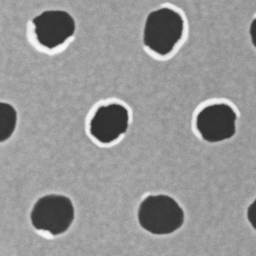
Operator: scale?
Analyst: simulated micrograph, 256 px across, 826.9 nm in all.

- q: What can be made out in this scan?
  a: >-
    holes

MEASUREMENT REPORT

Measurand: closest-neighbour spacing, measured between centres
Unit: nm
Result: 345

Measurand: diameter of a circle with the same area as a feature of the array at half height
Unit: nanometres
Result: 128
